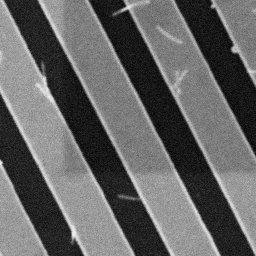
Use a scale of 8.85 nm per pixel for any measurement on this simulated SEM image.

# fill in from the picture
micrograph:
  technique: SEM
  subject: lines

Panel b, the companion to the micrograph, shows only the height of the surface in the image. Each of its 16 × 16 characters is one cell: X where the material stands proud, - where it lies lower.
---XXX--XXX--XXX
X--XXX---XXX--XX
X---XXX--XXX---X
XX--XXX---XXX--X
XX---XXX--XXX---
XXX--XXX---XXX--
XXX---XXX--XXX--
-XXX--XXX---XXX-
-XXXX--XXX--XXX-
--XXX--XXX---XXX
--XXXX--XXX--XXX
X--XXX--XXX---XX
X---XXX--XXX--XX
XX--XXX--XXX---X
XX---XXX--XXX--X
XXX--XXX--XXXX--